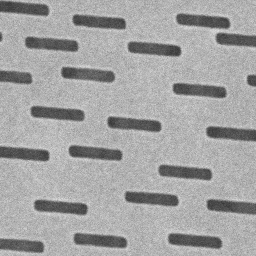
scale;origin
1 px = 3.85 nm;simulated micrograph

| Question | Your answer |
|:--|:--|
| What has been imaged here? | a regular array of holes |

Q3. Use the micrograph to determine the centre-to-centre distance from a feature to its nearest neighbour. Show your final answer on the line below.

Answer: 194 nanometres